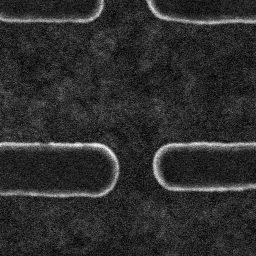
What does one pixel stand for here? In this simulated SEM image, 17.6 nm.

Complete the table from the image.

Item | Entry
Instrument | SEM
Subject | raised bodies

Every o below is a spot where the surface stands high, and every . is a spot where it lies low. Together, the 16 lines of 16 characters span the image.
oooooo...ooooooo
................
................
................
................
................
................
................
................
ooooooo...oooooo
ooooooo...oooooo
ooooooo...oooooo
................
................
................
................